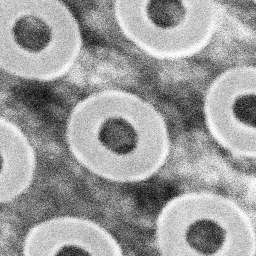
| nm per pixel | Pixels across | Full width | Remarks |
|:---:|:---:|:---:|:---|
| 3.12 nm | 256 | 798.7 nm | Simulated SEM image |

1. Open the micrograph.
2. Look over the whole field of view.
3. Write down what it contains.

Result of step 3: ring-shaped raised bodies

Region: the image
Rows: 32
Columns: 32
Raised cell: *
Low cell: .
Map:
********......****.....****.....
*********......***.....****.....
**...****......***.....****.....
*.....****.....*****..*****.....
**.....***......**********......
**....****.......********.......
***..****..........*****........
*********.......................
********........................
...****.....................****
...........................*****
..........................******
...........*******........***...
..........*********.......***...
.........***********......***...
*........****....***......****..
**......****.....****......*****
***......***.....****.......****
****.....****....****........***
****......***********...........
.***.......*********............
****........*******.............
****...........**...............
***.............................
**.....................****.....
.....................********...
....................**********..
.......***..........*****..****.
.....*******........***.....***.
....**********......***.....****
...*****..****......***.....****
...****....****.....*****...****